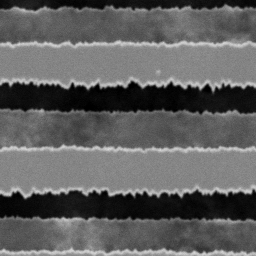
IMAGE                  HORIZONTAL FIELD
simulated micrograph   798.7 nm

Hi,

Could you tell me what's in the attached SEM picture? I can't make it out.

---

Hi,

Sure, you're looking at lines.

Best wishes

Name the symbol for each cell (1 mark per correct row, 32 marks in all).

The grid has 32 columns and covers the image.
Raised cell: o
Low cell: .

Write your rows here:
................................
oooooooooooooooooooooooooooooooo
oooooooooooooooooooooooooooooooo
oooooooooooooooooooooooooooooooo
oooooooooooooooooooooooooooooooo
oooooooooooooooooooooooooooooooo
oooooooooooooooooooooooooooooooo
oooooooooooooooooooooooooooooooo
oooooooooooooooooooooooooooooooo
oooooooooooooooooooooooooooooooo
....o.oooooooooo.oooo.oooooooooo
................................
................................
................................
oooooooooooooooooooooooooooooooo
oooooooooooooooooooooooooooooooo
oooooooooooooooooooooooooooooooo
oooooooooooooooooooooooooooooooo
oooooooooooooooooooooooooooooooo
oooooooooooooooooooooooooooooooo
oooooooooooooooooooooooooooooooo
oooooooooooooooooooooooooooooooo
oooooooooooooooooooooooooooooooo
oooooooooooooooooooooooooooooooo
...o............................
................................
................................
ooooooooooooooo.ooo.ooo.o..oo...
oooooooooooooooooooooooooooooooo
oooooooooooooooooooooooooooooooo
oooooooooooooooooooooooooooooooo
oooooooooooooooooooooooooooooooo